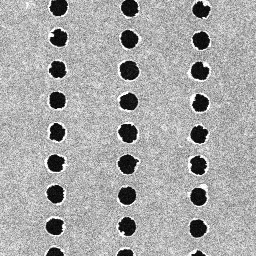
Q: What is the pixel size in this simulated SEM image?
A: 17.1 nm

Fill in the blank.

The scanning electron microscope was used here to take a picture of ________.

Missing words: a regular array of holes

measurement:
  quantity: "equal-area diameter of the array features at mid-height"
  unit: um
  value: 0.306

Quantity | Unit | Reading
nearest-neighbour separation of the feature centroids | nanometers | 532